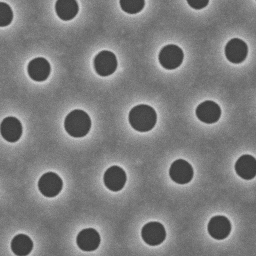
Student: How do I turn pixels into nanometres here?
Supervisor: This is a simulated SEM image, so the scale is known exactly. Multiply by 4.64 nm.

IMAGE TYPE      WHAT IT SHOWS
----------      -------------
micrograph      a regular array of holes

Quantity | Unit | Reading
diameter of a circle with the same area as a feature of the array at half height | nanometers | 116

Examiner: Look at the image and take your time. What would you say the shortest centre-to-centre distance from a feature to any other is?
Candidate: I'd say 304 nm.